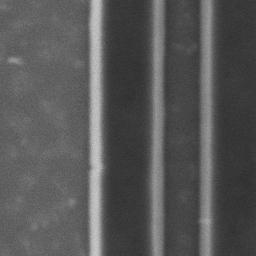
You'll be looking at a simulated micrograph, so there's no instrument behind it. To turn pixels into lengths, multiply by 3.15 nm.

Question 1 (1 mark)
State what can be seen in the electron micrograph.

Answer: one or a few lines or trenches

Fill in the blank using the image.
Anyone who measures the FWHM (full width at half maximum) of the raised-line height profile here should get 198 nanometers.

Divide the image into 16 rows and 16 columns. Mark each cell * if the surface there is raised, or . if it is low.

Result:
......****...***
......****...***
......****...***
......****...***
......****...***
......****...***
......****...***
......****...***
......****...***
......****...***
......****...***
......****...***
......****...***
......****...***
......****...***
......****...***